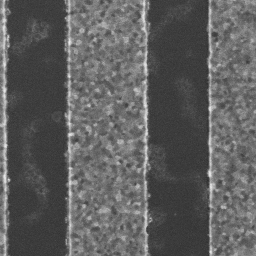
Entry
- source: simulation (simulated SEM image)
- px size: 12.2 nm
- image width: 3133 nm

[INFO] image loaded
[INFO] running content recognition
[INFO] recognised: one or a few lines or trenches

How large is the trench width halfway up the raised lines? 64.2 pixels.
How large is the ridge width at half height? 76.9 pixels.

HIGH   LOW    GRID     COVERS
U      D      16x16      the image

DDDDUUUUUDDDDUUU
DDDDUUUUUDDDDUUU
DDDDUUUUUDDDDUUU
DDDDUUUUUDDDDUUU
DDDDUUUUUDDDDUUU
DDDDUUUUUDDDDUUU
DDDDUUUUUDDDDUUU
DDDDUUUUUDDDDUUU
DDDDUUUUUDDDDUUU
DDDDUUUUUDDDDUUU
DDDDUUUUUDDDDUUU
DDDDUUUUUDDDDUUU
DDDDUUUUUDDDDUUU
DDDDUUUUUDDDDUUU
DDDDUUUUUDDDDUUU
DDDDUUUUUDDDDUUU